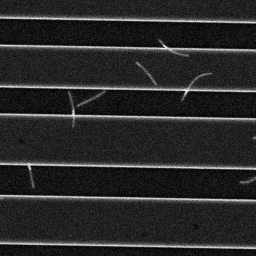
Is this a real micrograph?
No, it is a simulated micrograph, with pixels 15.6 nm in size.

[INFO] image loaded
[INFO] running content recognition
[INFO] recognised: groups of lines, slits or small figures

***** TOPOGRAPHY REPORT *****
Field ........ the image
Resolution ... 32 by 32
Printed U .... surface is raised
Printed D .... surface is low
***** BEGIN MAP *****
UUUUUUUUUUUUUUUUUUUUUUUUUUUUUUUU
UUUUUUUUUUUUUUUUUUUUUUUUUUUUUUUU
DDDDDDDDDDDDDDDDDUUUUUUUUUUUUUUU
DDDDDDDDDDDDDDDDDDDDDDDDDDDDDDDD
DDDDDDDDDDDDDDDDDDDDDDDDDDDDDDDD
DDDDDDDDDDDDDDDDDDDDDDDDDDDDDDDD
UUUUUUUUUUUUUUUUUUUUUUUUUUUUUUUU
UUUUUUUUUUUUUUUUUUUUUUUUUUUUUUUU
UUUUUUUUUUUUUUUUUUUUUUUUUUUUUUUU
UUUUUUUUUUUUUUUUUUUUUUUUUUUUUUUU
UUUUUUUUUUUUUUUUUUUUUUUUUUUUUUUU
DDDDDDDDDDDDDDDDDDDDDDDDDDDDDDDD
DDDDDDDDDDDDDDDDDDDDDDDDDDDDDDDD
DDDDDDDDDDDDDDDDDDDDDDDDDDDDDDDD
UUUUUUUUDUDDDDDDDDDDDDDDDDDDDDDD
UUUUUUUUUUUUUUUUUUUUUUUUUUUUUUUU
UUUUUUUUUUUUUUUUUUUUUUUUUUUUUUUU
UUUUUUUUUUUUUUUUUUUUUUUUUUUUUUUU
UUUUUUUUUUUUUUUUUUUUUUUUUUUUUUUU
UUUUUUUUUUUUUUUUUUUUUUUUUUUUUUUU
DDUUUUUUUUUUUUUUUUUUUUUUUUUUUUUU
DDDDDDDDDDDDDDDDDDDDDDDDDDDDDDDD
DDDDDDDDDDDDDDDDDDDDDDDDDDDDDDDD
DDDDDDDDDDDDDDDDDDDDDDDDDDDDDDDD
UUUDDDDDDDDDDDDDDDDDDDDDDDDDDDDD
UUUUUUUUUUUUUUUUUUUUUUUUUUUUUUUU
UUUUUUUUUUUUUUUUUUUUUUUUUUUUUUUU
UUUUUUUUUUUUUUUUUUUUUUUUUUUUUUUU
UUUUUUUUUUUUUUUUUUUUUUUUUUUUUUUU
UUUUUUUUUUUUUUUUUUUUUUUUUUUUUUUU
DDDDDUUUUUUUUUUUUUUUUUUUUUUUUUUU
DDDDDDDDDDDDDDDDDDDDDDDDDDDDDDDD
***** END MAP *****